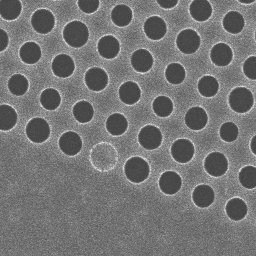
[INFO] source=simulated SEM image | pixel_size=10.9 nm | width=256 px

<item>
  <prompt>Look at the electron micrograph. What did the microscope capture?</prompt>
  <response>a regular array of holes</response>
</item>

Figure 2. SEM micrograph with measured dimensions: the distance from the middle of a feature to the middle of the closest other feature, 374 nanometers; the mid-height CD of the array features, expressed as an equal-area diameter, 0.244 micrometres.